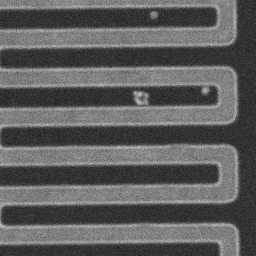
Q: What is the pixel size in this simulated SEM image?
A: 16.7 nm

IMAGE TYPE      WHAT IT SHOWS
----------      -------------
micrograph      groups of lines, slits or small figures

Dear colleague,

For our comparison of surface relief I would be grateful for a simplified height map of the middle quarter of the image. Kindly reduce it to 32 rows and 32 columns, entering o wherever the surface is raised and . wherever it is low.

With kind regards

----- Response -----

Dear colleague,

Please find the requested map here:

oooooooooooooooooooooooooooooooo
................................
................................
................................
................................
oooooooooooooooooooooooooooooooo
oooooooooooooooooooooooooooooooo
oooooooooooooooooooooooooooooooo
oooooooooooooooooooooooooooooooo
oooooooooooooooooooooooooooooooo
oooooooooooooooooooooooooooooooo
................................
................................
................................
................................
oooooooooooooooooooooooooooooooo
oooooooooooooooooooooooooooooooo
oooooooooooooooooooooooooooooooo
oooooooooooooooooooooooooooooooo
oooooooooooooooooooooooooooooooo
ooooooooooooooooooooooooooo.....
................................
................................
................................
................................
oooooooooooooooooooooooooooooooo
oooooooooooooooooooooooooooooooo
oooooooooooooooooooooooooooooooo
oooooooooooooooooooooooooooooooo
oooooooooooooooooooooooooooooooo
ooooooooooooooo..oooooo.........
................................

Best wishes